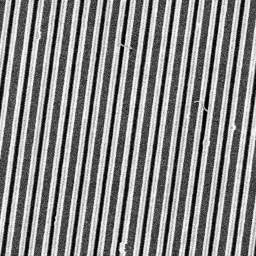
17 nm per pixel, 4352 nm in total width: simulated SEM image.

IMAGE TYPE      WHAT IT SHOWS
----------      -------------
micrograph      parallel lines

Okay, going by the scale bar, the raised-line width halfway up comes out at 80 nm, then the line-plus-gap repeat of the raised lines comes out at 0.193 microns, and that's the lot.